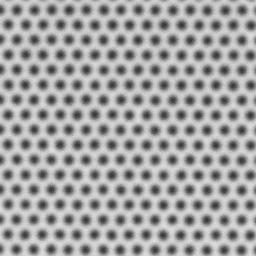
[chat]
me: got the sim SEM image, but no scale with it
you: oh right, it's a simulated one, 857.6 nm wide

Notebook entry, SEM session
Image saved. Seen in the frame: a regular array of holes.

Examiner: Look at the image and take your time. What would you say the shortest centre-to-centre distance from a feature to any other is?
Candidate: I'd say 56.1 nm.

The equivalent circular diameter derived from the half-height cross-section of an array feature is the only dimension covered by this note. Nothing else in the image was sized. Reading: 0.0362 µm